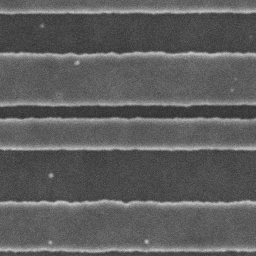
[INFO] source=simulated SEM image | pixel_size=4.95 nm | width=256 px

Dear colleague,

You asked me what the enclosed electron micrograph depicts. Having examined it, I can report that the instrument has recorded lines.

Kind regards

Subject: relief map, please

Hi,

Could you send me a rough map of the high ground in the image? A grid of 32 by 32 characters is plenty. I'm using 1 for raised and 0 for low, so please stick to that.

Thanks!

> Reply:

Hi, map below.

11111111111111111111111111111111
11111111011110000001001000000000
00000000000000000000000000000000
00000000000000000000000000000000
00000000000000000000000000000000
00000000000000000000000000000000
00000000000000000000000000000000
11111111111111111111111111111111
11111111111111111111111111111111
11111111111111111111111111111111
11111111111111111111111111111111
11111111111111111111111111111111
11111111111111111111111111111111
00000000000000000000000000000000
00000000000000000000000000000000
11111111111111111111111111111111
11111111111111111111111111111111
11111111111111111111111111111111
11111111111111111111111111111111
00000000000000000000000000000000
00000000000000000000000000000000
00000000000000000000000000000000
00000000000000000000000000000000
00000000000000000000000000000000
00000000000000000000000000000000
11111111111111111111111111111111
11111111111111111111111111111111
11111111111111111111111111111111
11111111111111111111111111111111
11111111111111111111111111111111
11111111111111111111111111111111
00000000000000000000000000000000